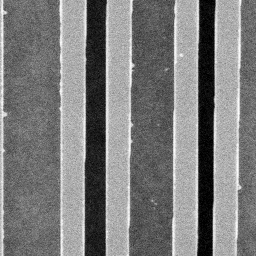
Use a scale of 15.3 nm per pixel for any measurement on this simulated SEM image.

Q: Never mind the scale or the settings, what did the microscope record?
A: lines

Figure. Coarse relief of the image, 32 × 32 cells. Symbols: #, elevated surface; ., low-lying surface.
........###..###......###..###..
........###..###......###..###..
........###..###......###..###..
........###..###......###..###..
........###..###......###..###..
........###..###......###..###..
........###..###......###..###..
........###..###......###..###..
........###..###......###..###..
........###..###......###..###..
........###..###......###..###..
........###..###......###..###..
........###..###......###..###..
........###..###......###..###..
........###..###......###..###..
........###..###......###..###..
........###..###......###..###..
........###..###......###..###..
........###..###......###..###..
........###..###......###..###..
........###..###......###..###..
........##...###......###..###..
........##...###......###..###..
........##...###......###..###..
........##...###......###..###..
........##...###......###..###..
........##...###......###..###..
........##...###......###..###..
........##...###......###..###..
........##...###......###..###..
........##...###......###..##...
........##...###......###..##...